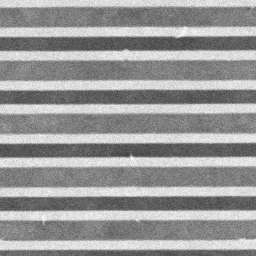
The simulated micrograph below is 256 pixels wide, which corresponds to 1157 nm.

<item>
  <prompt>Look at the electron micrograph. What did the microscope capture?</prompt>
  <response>parallel lines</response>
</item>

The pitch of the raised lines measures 120 nm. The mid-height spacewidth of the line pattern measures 88.1 nanometres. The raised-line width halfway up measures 44 nm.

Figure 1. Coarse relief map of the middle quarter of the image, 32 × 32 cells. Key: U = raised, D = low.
DDDDDDDDDDDDDDDDDDDDDDDDDDDDDDDD
DDDDDDDDDDDDDDDDDDDDDDDDDDDDDDDD
DDDDDDDDDDDDDDDDDDDDDDDDDDDDDDDD
DDDDDDDDDDDDDDDDDDDDDDDDDDDDDDDD
UUUUUUUUUUUUUUUUUUUUUUUUUUUUUUUU
UUUUUUUUUUUUUUUUUUUUUUUUUUUUUUUU
DDDDDDDDDDDDDDDDDDDDDDDDDDDDDDDD
DDDDDDDDDDDDDDDDDDDDDDDDDDDDDDDD
DDDDDDDDDDDDDDDDDDDDDDDDDDDDDDDD
DDDDDDDDDDDDDDDDDDDDDDDDDDDDDDDD
UUUUUUUUUUUUUUUUUUUUUUUUUUUUUUUU
UUUUUUUUUUUUUUUUUUUUUUUUUUUUUUUU
DDDDDDDDDDDDDDDDDDDDDDDDDDDDDDDD
DDDDDDDDDDDDDDDDDDDDDDDDDDDDDDDD
DDDDDDDDDDDDDDDDDDDDDDDDDDDDDDDD
DDDDDDDDDDDDDDDDDDDDDDDDDDDDDDDD
DDDDDDDDDDDDDDDDDDDDDDDDDDDDDDDD
DDDDDDDDDDDDUUUUUUUUUUUUUUUUUUUU
UUUUUUUUUUUUUUUUUUUUUUUUUUUUUUUU
UUUUUUUUUUUUUUUUUUUUUUUUUUUUUUUU
DDDDDDDDDDDDDDDDDDDDDDDDDDDDDDDD
DDDDDDDDDDDDDDDDDDDDDDDDDDDDDDDD
DDDDDDDDDDDDDDDDDDDDDDDDDDDDDDDD
DDDDDDDDDDDDDDUUUUUUUUUUUUUUUUUU
UUUUUUUUUUUUUUUUUUUUUUUUUUUUUUUU
UUUUUUUUUUUUUUUUDDDDDUUUUUUUUUUU
DDDDDDDDDDDDDDDDDDDDDDDDDDDDDDDD
DDDDDDDDDDDDDDDDDDDDDDDDDDDDDDDD
DDDDDDDDDDDDDDDDDDDDDDDDDDDDDDDD
DDDDDDDDDDDDDDDDDDDDDDDDDDDDDDDD
DDDDDDDDDDDDDDDDDDDDDDDDDDDDDDDD
UUUUUUUUUUUUUUUUUUUUUUUUUUUUUUUU